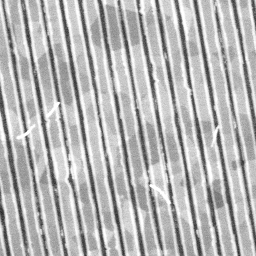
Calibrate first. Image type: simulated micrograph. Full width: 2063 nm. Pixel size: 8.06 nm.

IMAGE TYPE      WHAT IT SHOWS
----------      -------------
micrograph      parallel lines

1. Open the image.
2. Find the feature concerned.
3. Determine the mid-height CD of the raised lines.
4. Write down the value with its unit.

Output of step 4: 95.3 nm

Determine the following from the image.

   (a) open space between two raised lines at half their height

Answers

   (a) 60.6 nm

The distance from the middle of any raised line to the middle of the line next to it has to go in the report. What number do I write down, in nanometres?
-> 152